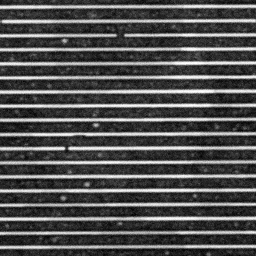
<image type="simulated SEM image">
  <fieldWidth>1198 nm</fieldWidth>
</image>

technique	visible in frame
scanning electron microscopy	parallel lines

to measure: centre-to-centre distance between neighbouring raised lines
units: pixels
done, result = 14.1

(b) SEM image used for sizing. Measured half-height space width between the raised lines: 56.2 nm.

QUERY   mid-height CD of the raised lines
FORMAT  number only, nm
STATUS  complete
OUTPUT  11.1